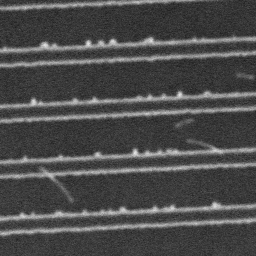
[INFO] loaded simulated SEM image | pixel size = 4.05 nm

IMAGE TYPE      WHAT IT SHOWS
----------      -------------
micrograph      lines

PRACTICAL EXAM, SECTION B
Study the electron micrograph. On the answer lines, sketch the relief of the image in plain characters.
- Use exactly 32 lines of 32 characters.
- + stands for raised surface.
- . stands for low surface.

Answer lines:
+++++++++++++++.................
................................
................................
................................
................................
.....+......+++.++++++++++++++++
++++++++++++++++++++++++++++++++
+++++++++++++++++...............
................................
................................
................................
................................
................++++++++++++++++
++++++++++++++++++++++++++++++++
++++++++++++++++................
................................
................................
................................
................................
............+.++++++++++++++++++
++++++++++++++++++++++++++++++++
++++++++++++++..................
................................
................................
................................
................................
...............+++++++++++++++++
++++++++++++++++++++++++++++++++
+++++++++++++++.................
................................
................................
................................